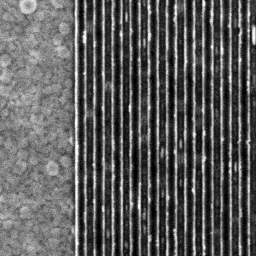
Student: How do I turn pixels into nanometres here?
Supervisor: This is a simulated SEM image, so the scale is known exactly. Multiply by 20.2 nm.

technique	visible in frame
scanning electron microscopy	parallel lines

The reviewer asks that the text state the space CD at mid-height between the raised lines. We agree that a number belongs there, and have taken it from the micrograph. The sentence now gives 0.162 microns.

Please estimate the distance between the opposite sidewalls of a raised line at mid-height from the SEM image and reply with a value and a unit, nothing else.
202 nm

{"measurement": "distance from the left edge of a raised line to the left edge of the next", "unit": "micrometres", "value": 0.367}